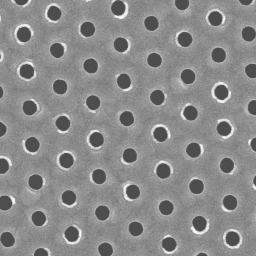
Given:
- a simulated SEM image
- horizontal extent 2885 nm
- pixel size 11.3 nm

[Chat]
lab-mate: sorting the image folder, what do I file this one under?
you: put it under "a regular array of holes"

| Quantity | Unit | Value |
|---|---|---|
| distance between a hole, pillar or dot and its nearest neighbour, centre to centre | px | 36.6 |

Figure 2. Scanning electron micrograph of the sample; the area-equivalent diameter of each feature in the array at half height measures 167 nm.